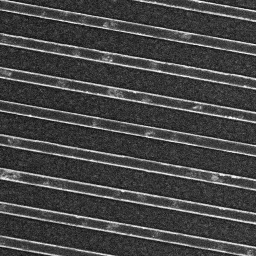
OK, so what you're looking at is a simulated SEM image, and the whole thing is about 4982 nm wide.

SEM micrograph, parallel lines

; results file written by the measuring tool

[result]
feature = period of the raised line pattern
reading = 33.2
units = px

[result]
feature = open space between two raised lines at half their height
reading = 0.431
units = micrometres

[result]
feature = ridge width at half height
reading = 216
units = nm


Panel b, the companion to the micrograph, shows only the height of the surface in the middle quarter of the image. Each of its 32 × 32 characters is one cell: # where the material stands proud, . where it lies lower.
...............################.
.....................###########
...........................#####
................................
####............................
##########......................
..###############...............
.......##############...........
.............##############.....
...................#############
........................########
..............................##
###.............................
#########.......................
###############.................
.....###############............
...........###############......
................################
......................##########
............................####
#...............................
#######.........................
############....................
...###############..............
........################........
..............###############...
....................############
.........................#######
...............................#
####............................
#########.......................
##############..................